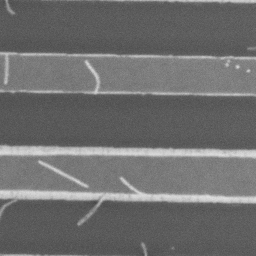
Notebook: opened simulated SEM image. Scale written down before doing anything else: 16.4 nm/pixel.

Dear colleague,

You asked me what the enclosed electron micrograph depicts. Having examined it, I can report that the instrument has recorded lines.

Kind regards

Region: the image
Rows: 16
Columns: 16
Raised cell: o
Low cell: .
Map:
................
................
................
ooooooooooo.....
oooooooooooooooo
oooooooooooooooo
................
................
................
ooooooooooooo...
oooooooooooooooo
oooooooooooooooo
..............oo
................
................
................